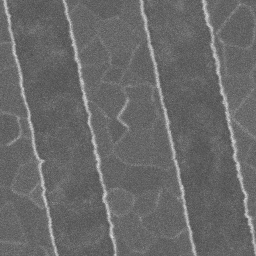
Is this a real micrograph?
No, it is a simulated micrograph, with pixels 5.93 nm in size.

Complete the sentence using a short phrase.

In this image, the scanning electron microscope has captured one or a few lines or trenches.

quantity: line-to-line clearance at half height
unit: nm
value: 349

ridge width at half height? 451 nanometres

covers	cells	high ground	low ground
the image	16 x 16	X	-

----XXXXX----XXX
X---XXXXX----XXX
X----XXXX----XXX
X----XXXXX---XXX
X----XXXXX----XX
X----XXXXX----XX
XX---XXXXX----XX
XX----XXXX----XX
XX----XXXXX---XX
XX----XXXXX----X
XXX---XXXXX----X
XXX---XXXXX----X
XXX----XXXX----X
XXX----XXXXX---X
XXX----XXXXX----
XXX----XXXXX----